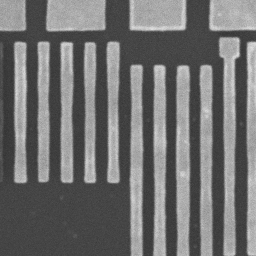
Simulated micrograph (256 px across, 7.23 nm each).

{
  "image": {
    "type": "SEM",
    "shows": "wiring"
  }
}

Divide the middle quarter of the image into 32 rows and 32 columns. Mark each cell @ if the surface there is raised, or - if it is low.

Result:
@@---@@@---@@@---@@----@@-------
@@---@@@---@@@---@@----@@----@@-
@@---@@@---@@@---@@----@@----@@-
@@---@@@---@@@---@@----@@---@@@-
@@---@@@---@@@---@@----@@---@@@-
@@---@@@---@@@---@@----@@---@@@-
@@---@@@---@@----@@----@@---@@@-
@@---@@@---@@----@@----@@---@@@-
@@---@@@---@@----@@----@@---@@@-
@@---@@@---@@----@@----@@---@@@-
@@---@@@---@@----@@----@@---@@@-
@@---@@@---@@----@@----@@---@@@-
@@---@@@---@@----@@----@@---@@@-
@@---@@@---@@----@@----@@---@@@-
@@---@@@---@@----@@----@@---@@@-
@@---@@@---@@----@@----@@---@@@-
@@---@@@---@@----@@----@@---@@@-
@@---@@@---@@----@@----@@---@@@-
@@---@@@---@@----@@----@@---@@@-
@@---@@@---@@----@@----@@---@@@-
@@---@@@---@@----@@@---@@---@@@-
@@---@@@---@@----@@@---@@---@@@-
@@---@@@---@@----@@----@@---@@@-
@@---@@@---@@----@@----@@---@@@-
@@---@@@---@@----@@----@@---@@@-
@@---@@@---@@@---@@----@@---@@@-
@@---@@@---@@@---@@----@@---@@@-
@@---@@@---@@@---@@----@@---@@@-
@@---@@@---@@@---@@----@@---@@@-
-----------------@@----@@---@@@-
-----------------@@----@@---@@@-
-----------------@@----@@---@@@-